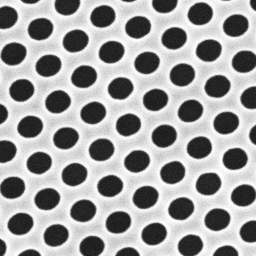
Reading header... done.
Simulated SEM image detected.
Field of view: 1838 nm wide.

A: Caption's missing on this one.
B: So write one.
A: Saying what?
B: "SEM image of a regular array of holes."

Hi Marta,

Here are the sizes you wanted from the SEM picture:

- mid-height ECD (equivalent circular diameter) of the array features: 0.175 um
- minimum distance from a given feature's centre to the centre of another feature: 262 nm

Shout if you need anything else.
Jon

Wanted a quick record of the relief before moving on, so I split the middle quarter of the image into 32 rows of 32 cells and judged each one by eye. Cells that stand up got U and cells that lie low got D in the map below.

UUUUDDUUUUUUUUUUUDDDDDDDUUUUDDDD
UUUDDDDDUUUUUUUUUUDDDDDUUUUDDDDD
UUDDDDDDUUUUUUUUUUUUDUUUUUDDDDDD
UUDDDDDDUUUUUDDDUUUUUUUUUUDDDDDD
UUDDDDDDUUUUDDDDDUUUUUUUUUUDDDDD
UUUDDDDUUUUDDDDDDUUUUUUUUUUUDDUU
UUUUUUUUUUUDDDDDDUUUUDDDUUUUUUUU
DUUUUUUUUUUDDDDDDUUUDDDDDDUUUUUU
DDUUUUUUUUUUDDDDUUUUDDDDDDUUUUUU
DDUUUUUDDUUUUUUUUUUUDDDDDDUUUUDD
DUUUUDDDDDUUUUUUUUUUDDDDDUUUUDDD
DUUUDDDDDDUUUUUUUUUUUDDDUUUUUDDD
UUUUDDDDDDDUUUUDDUUUUUUUUUUUDDDD
UUUUDDDDDDUUUUDDDDDUUUUUUUUUUDDD
UUUUUDDDDUUUUDDDDDDUUUUUUUUUUUDD
UUUUUUUUUUUUUDDDDDDUUUUUDDDUUUUU
DDDUUUUUUUUUUDDDDDDUUUDDDDDDUUUU
DDDDUUUUUUUUUUDDDDUUUUDDDDDDUUUU
DDDDUUUUUUUUUUUUUUUUUUDDDDDDUUUU
DDDUUUUDDDDDUUUUUUUUUUDDDDDDUUUD
DDUUUUDDDDDDUUUUUUUUUUUDDDDUUUUD
UUUUUUDDDDDDDUUUUUDUUUUUUUUUUUUD
UUUUUUDDDDDDUUUUDDDDDUUUUUUUUUUD
UUUUUUUDDDDUUUUDDDDDDUUUUUUUUUUU
UUUUUUUUUUUUUUUDDDDDDDUUUUUDDUUU
UDDDDUUUUUUUUUUDDDDDDUUUUDDDDDUU
DDDDDDUUUUUUUUUUDDDDUUUUDDDDDDUU
DDDDDDUUUUUUUUUUUUUUUUUUDDDDDDUU
DDDDDDUUUDDDDDUUUUUUUUUUDDDDDDUU
DDDDDUUUDDDDDDDUUUUUUUUUUDDDDUUU
UUDUUUUUDDDDDDDUUUUUDUUUUUUUUUUU
UUUUUUUUDDDDDDDUUUDDDDDUUUUUUUUU